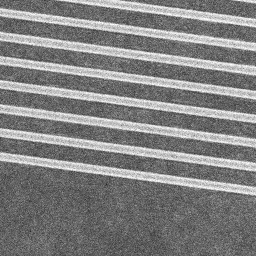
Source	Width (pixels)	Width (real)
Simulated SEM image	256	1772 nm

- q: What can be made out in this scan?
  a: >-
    parallel lines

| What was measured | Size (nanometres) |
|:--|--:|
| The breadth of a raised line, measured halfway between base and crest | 54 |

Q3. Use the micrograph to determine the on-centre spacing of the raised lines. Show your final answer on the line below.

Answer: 165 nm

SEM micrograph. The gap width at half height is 114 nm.